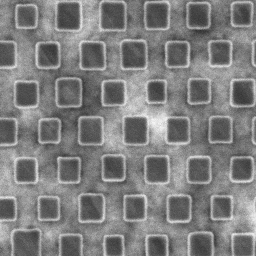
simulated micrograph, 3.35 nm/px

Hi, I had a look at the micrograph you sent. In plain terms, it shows a regular array of raised bodies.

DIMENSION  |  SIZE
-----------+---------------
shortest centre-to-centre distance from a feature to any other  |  142 nanometres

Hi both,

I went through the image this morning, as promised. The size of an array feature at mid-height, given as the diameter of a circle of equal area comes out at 27.9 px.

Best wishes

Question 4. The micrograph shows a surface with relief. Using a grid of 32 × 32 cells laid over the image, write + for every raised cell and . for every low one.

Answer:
.......+++...+++..+++...++...++.
..+++..+++..++++..+++..+++...+++
..+++..+++...+++..+++..+++...+++
..++...+++...+++..+++...++......
................................
++...++...+++..+++...+++..+++...
++...++...+++..+++...+++..+++...
++...+++..+++..+++...+++..+++...
.....++...+++..+++..............
................................
..+++..+++...+++..+++...++...+++
..+++..+++...+++..+++...++...+++
..+++..+++...+++..+++..+++...+++
................................
................................
++...+++..+++..++++..+++..+++...
++...+++..+++..++++..+++..+++...
++...++...+++..++++..+++..+++...
................................
.............++...+++...........
..+++..+++...+++..+++..+++...+++
..+++..+++...+++..+++..+++...+++
..+++..+++...++...+++..+++...++.
................................
..........+++...++...++.........
++...++...+++...++...+++..+++...
++...++...+++...++...+++..+++...
++...++...+++...++...+++........
................................
.++++...++...++....++...+++..+++
..+++..+++...++...+++...+++..+++
..+++..+++...++...+++...+++..+++